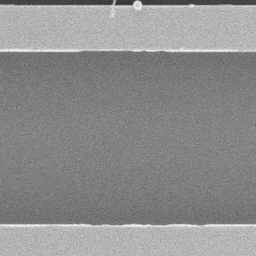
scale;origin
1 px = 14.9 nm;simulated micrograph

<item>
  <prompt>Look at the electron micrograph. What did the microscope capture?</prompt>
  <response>lines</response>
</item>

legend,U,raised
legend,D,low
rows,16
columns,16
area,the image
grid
UUUUUUUUUUUUUUUU
UUUUUUUUUUUUUUUU
UUUUUUUUUUUUUUUU
DDDDDDDDDDDDDDDD
DDDDDDDDDDDDDDDD
DDDDDDDDDDDDDDDD
DDDDDDDDDDDDDDDD
DDDDDDDDDDDDDDDD
DDDDDDDDDDDDDDDD
DDDDDDDDDDDDDDDD
DDDDDDDDDDDDDDDD
DDDDDDDDDDDDDDDD
DDDDDDDDDDDDDDDD
DDDDDDDDDDDDDDDD
UUUUUUUUUUUUUUUU
UUUUUUUUUUUUUUUU